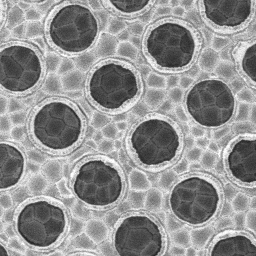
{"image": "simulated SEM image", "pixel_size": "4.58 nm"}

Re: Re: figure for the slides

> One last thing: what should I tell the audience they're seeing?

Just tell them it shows a regular array of holes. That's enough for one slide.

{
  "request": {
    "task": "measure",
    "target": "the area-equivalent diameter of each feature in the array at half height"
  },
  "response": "0.216 micrometres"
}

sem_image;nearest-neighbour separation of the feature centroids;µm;0.317